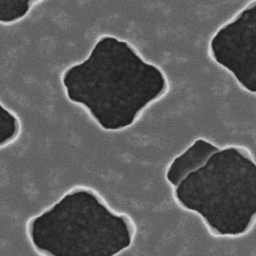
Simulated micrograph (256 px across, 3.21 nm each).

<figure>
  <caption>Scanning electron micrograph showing holes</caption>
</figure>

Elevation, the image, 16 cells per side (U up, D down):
DDUUUUUUUUUUUUUD
UUUUUUUUUUUUUUDD
UUUUUUDUUUUUUDDD
UUUUUUDDDUUUUDDD
UUUUDDDDDDUUUUDD
UUUUDDDDDDUUUUUD
UUUUUDDDDUUUUUUU
DUUUUUDDUUUUUUUU
DUUUUUUUUUUUUUUU
UUUUUUUUUUUUDDDU
UUUUUUUUUUUDDDDD
UUUUUUUUUUUDDDDD
UUUUDDUUUUUDDDDD
UUDDDDDUUUUUUDDD
UUDDDDDDUUUUUUDU
UUDDDDDDUUUUUUUU